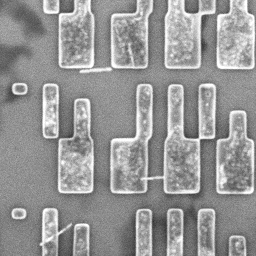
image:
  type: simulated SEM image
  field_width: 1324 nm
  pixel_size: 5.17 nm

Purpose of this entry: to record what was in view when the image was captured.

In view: wiring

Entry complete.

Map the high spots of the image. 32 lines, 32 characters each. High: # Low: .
......#..##......##..##..##..##.
......#..##......##..##..#...##.
........####..####...####..#####
........####..####...####..#####
........####..####...####..#####
........####..####...####..#####
........####..####...####..#####
........####..####...####..#####
............................###.
................................
................................
..#..##..........##..##..##.....
.....##...#......##..##..##.....
......#..##......##..##..##.....
......#..##......##..##..##..##.
.....##..##......##..##..##..##.
.....##..##......##..##..##..##.
........###...#.###..####...###.
.......#####..####...####..#####
.......#####..####...####..#####
.......#####..####...####..#####
.......#####..####...####..#####
.......#####..####...####..#####
.......#####..####...####..#####
................................
................................
..#...#..........##..##..##.....
.....##..........##..##..##.....
.....##..##......##..##..##.....
.....##..##......##..##..##.....
.....##..##......##..##..##..##.
.....##..##......##..##..##..##.